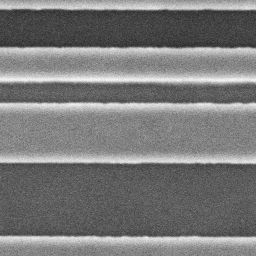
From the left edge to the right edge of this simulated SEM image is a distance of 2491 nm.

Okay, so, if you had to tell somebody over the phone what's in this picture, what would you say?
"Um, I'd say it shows lines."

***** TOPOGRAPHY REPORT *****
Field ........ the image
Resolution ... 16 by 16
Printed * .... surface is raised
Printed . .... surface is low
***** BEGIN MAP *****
****************
................
................
****************
****************
****************
****************
****************
****************
****************
................
................
................
................
................
****************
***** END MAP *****